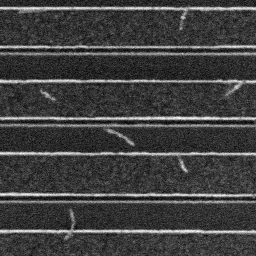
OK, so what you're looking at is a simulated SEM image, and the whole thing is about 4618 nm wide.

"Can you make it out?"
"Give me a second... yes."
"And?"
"lines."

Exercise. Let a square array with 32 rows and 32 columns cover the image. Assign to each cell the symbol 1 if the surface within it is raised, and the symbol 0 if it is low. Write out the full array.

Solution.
00000000000000000000000000000000
11111111111111111111111111111111
11111111111111111111111111111111
11111111111111111111111111111111
11111111111111111111111111111111
11111111111111111111111111111111
00000000000000000000000000000000
00000000000000000000000000000000
00000000000000000000000000000000
00000000000000000000000000000000
11111111111111111111111111111111
11111111111111111111111111111111
11111111111111111111111111111111
11111111111111111111111111111111
11111111111111111111111111111111
00000000000000000000000000000000
00000000000000000000000000000000
00000000000000000000000000000000
00000000000000000000000000000000
11111111111111111111111111111111
11111111111111111111111111111111
11111111111111111111111111111111
11111111111111111111111111111111
11111111111111111111111111111111
00000000000000000000000000000000
00000000000000000000000000000000
00000000000000000000000000000000
00000000000000000000000000000000
00000000000000000000000000000000
11111111111111111111111111111111
11111111111111111111111111111111
11111111111111111111111111111111